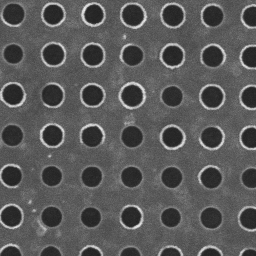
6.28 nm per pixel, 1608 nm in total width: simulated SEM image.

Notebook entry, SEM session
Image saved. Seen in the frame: a regular array of holes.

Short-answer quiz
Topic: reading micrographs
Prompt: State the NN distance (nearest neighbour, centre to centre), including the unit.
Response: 250 nm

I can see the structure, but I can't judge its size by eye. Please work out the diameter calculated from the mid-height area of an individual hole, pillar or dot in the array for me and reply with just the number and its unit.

131 nm